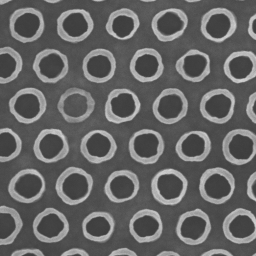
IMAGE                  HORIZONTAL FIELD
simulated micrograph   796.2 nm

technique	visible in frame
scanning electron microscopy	a regular array of ring-shaped raised bodies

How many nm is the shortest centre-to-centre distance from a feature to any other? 144